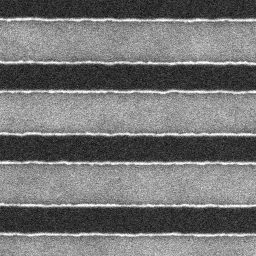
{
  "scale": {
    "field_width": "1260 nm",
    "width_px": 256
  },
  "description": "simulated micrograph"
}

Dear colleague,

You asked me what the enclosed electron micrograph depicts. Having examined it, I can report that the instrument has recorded lines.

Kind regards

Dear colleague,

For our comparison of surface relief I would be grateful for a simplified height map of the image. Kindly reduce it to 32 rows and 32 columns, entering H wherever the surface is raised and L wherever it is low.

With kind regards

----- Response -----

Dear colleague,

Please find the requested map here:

HHHHHHHHHHHHHHHHHHHHHHHHHHHHHHHH
HHHHHHHHHHHHHHHHHHHHHHHHHHHHHHHH
LHLLLHHLLHLHHLHHHHHHHHHHHHHHHHHH
LLLLLLLLLLLLLLLLLLLLLLLLLLLLLLLL
LLLLLLLLLLLLLLLLLLLLLLLLLLLLLLLL
LLLLLLLLLLLLLLLLLLLLLLLLLLLLLLLL
LLLLLLLLLLLLLLLLLLLLLLLLLLLLLLLL
LLLLLLLLLLLLLLLLLLLLLLLLLLLLLLLL
HHHHHHHHHHHHHHHHHHHHHHHHHHHHHHHH
HHHHHHHHHHHHHHHHHHHHHHHHHHHHHHHH
HHHHHHHHHHHHHHHHHHHHHHHHHHHHHHHH
HHLHLLHLHHHLHHHHHHHHHLHHHHHLHHHH
LLLLLLLLLLLLLLLLLLLLLLLLLLLLLLLL
LLLLLLLLLLLLLLLLLLLLLLLLLLLLLLLL
LLLLLLLLLLLLLLLLLLLLLLLLLLLLLLLL
LLLLLLLLLLLLLLLLLLLLLLLLLLLLLLLL
LLLLLLLLLLLLLLLLLLLLLLLLLLLLLLLL
HHHHHHHHHHHHHHHHHHHHHHHHHHHHHHHH
HHHHHHHHHHHHHHHHHHHHHHHHHHHHHHHH
HHHHHHHHHHHHHHHHHHHHHHHHHHHHHHHH
LLLLLLLLLLLLLLLLLLLLLLLLLLLLLLLL
LLLLLLLLLLLLLLLLLLLLLLLLLLLLLLLL
LLLLLLLLLLLLLLLLLLLLLLLLLLLLLLLL
LLLLLLLLLLLLLLLLLLLLLLLLLLLLLLLL
LLLLLLLLLLLLLLLLLLLLLLLLLLLLLLLL
HLLLLLLLLLLLLLLLLLLLLLLLLLLLLLLL
HHHHHHHHHHHHHHHHHHHHHHHHHHHHHHHH
HHHHHHHHHHHHHHHHHHHHHHHHHHHHHHHH
HHHHHHHHHHHHHHHHHHHHHHHHHHHHHHHH
LLLLLLLLLLLLLLLLLLLLLLLLLLLLLLLL
LLLLLLLLLLLLLLLLLLLLLLLLLLLLLLLL
LLLLLLLLLLLLLLLLLLLLLLLLLLLLLLLL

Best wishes